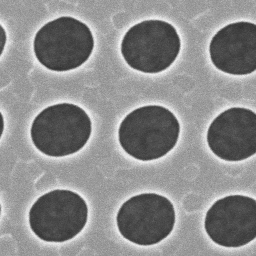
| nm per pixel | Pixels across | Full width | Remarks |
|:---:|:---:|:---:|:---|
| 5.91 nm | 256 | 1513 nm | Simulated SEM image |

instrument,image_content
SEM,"holes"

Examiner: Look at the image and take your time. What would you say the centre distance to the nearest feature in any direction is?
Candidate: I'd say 0.509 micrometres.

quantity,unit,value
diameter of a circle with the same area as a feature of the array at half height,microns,0.336